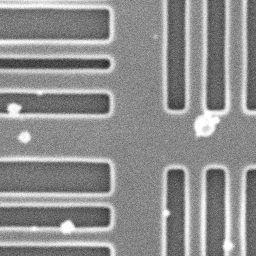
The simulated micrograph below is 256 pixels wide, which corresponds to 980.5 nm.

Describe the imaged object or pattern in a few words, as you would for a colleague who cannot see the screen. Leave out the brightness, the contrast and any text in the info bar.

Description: groups of lines, slits or small figures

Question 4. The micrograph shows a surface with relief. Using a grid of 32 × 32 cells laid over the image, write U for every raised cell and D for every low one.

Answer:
UUUUUUUUUUUUUUUUUUUUUDDUUUDDUUUD
DDDDDDDDDDDDDDUUUUUUUDDUUUDDUUUD
DDDDDDDDDDDDDDUUUUUUUDDUUUDDUUUD
DDDDDDDDDDDDDDUUUUUUUDDUUUDDUUUD
DDDDDDDDDDDDDDUUUUUUUDDUUUDDUUUD
UUUUUUUUUUUUUUUUUUUUUDDUUUDDUUUD
UUUUUUUUUUUUUUUUUUUUUDDUUUDDUUUD
DDDDDDDDDDDDDDUUUUUUUDDUUUDDUUUD
DDDDDDDDDDDDDDUUUUUUUDDUUUDDUUUD
UUUUUUUUUUUUUUUUUUUUUDDUUUDDUUUD
UUUUUUUUUUUUUUUUUUUUUDDUUUDDUUUD
UDDUUUUUUUUUUUUUUUUUUDDUUUDDUUUD
DDDDDDDDDDDDDDUUUUUUUDDUUUDDUUUD
DUDDDDDDDDDDDDUUUUUUUDDUUUDDUUUD
UUUUUUUUUUUUUUUUUUUUUUUUUUUUUUUU
UUUUUUUUUUUUUUUUUUUUUUUUUUUUUUUU
UUUUUUUUUUUUUUUUUUUUUUUUUUUUUUUU
UUUUUUUUUUUUUUUUUUUUUUUUUUUUUUUU
UUUUUUUUUUUUUUUUUUUUUUUUUUUUUUUU
UUUUUUUUUUUUUUUUUUUUUUUUUUUUUUUU
DDDDDDDDDDDDDDUUUUUUUUUUUUUUUUUU
DDDDDDDDDDDDDDUUUUUUUDDUUUDDUUUD
DDDDDDDDDDDDDDUUUUUUUDDUUUDDUUUD
DDDDDDDDDDDDDDUUUUUUUDDUUUDDUUUD
UUUUUUUUUUUUUUUUUUUUUDDUUUDDUUUD
UUUUUUUUUUUUUUUUUUUUUDDUUUDDUUUD
DDDDDDDDDDDDDDUUUUUUUDDUUUDDUUDD
DDDDDDDDDDDDDDUUUUUUUDDUUUDDUUDD
UUUUUUUUUDDDDUUUUUUUUDDUUUDDUUDD
UUUUUUUUUUUUUUUUUUUUUDDUUUDDUUDD
UUUUUUUUUUUUUUUUUUUUUDDUUUDDUUUD
DDDDDDDDDDDDDDUUUUUUUDDUUUDDUUUD